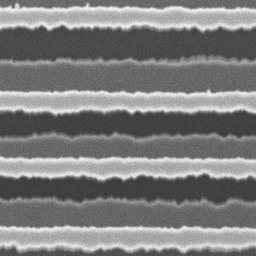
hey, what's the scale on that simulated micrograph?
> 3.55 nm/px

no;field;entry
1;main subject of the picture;lines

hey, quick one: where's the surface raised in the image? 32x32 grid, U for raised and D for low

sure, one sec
UUUUUUUUUUUUUUUUUUUUUUUUUUUUUUUU
UUUUUUUUUUUUUUUUUUUUUUUUUUUUUUUU
UUUUUUUUUUUUUUUUUUUUUUUUUUUUUUUU
UDDDDDUDUDDDDDDUDDDUUUUUDUUDUUUD
DDDDDDDDDDDDDDDDDDDDDDDDDDDDDDDD
DDDDDDDDDDDDDDDDDDDDDDDDDDDDDDDD
DDDDDDDDDDDDDDDDDDDDDDDDDDDDDDDD
DDDDDDDDDDDDDDDDUDDDDDDDDDUDDDDD
UUUUUUUUUUUUUUUUUUUUUUUUUUUUUUUU
UUUUUUUUUUUUUUUUUUUUUUUUUUUUUUUU
UUUUUUUUUUUUUUUUUUUUUUUUUUUUUUUU
UUUUUUUUUUUUUUUUUUUUUUUUUUUUUUUU
UUUUUUUUUUUUUUUUUUUUUUUUUUUUUUUU
UUUUUUUUUUUUUUUUUUUUUUUUUUUUUUUU
DDDDDDDDDDDDDDDDDDDDDDDDDDDDDDDD
DDDDDDDDDDDDDDDDDDDDDDDDDDDDDDDD
DDDDDDDDDDDDDDDDDDDDDDDDDDDDDDDD
UUUUUUUUUUUUUUUUUUUUUUUUUUUUUUUU
UUUUUUUUUUUUUUUUUUUUUUUUUUUUUUUU
UUUUUUUUUUUUUUUUUUUUUUUUUUUUUUUU
UUUUUUUUUUUUUUUUUUUUUUUUUUUUUUUU
UUUUUUUUUUUUUUUUUUUUUUUUUUUUUUUU
DDDDDDDDDDDDUDDDDDDDDDDDDDDDDDDD
DDDDDDDDDDDDDDDDDDDDDDDDDDDDDDDD
DDDDDDDDDDDDDDDDDDDDDDDDDDDDDDDD
UUUUUUUUUUUUUUUUUUUUUUDUUUUDUUUU
UUUUUUUUUUUUUUUUUUUUUUUUUUUUUUUU
UUUUUUUUUUUUUUUUUUUUUUUUUUUUUUUU
UUUUUUUUUUUUUUUUUUUUUUUUUUUUUUUU
UUUUUUUUUUUUUUUUUUUUUUUUUUUUUUUU
UUUUUUUUUUUUUUUUUUUUUUUUUUUUUUUU
DDDDDDDDDDDDDDDDDDDDDDDDDDDDDDDD